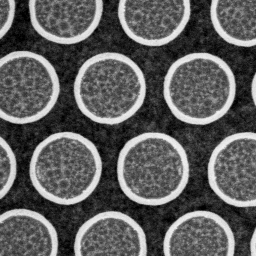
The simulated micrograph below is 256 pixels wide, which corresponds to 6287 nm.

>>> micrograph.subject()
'raised bodies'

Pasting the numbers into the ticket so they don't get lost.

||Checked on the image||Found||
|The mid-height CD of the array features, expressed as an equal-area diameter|66.5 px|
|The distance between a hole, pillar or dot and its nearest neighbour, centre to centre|2180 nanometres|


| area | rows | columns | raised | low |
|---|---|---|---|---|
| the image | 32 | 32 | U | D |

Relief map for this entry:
UDDDUUUUUUUUDDDUUUUUUUUDDDDUUUUU
UDDDUUUUUUUUDDDUUUUUUUUDDDDUUUUU
UDDDUUUUUUUUDDDUUUUUUUUDDDDUUUUU
UDDDDUUUUUUDDDDDUUUUUUUDDDDUUUUU
DDDDDDUUUUDDDDDDDUUUUUDDDDDDUUUU
DDDDDDDDDDDDDDDDDDDDDDDDDDDDDDDD
DDDDDDDDDDDDDDDDDDDDDDDDDDDDDDDD
DUUUUDDDDDDDUUUUDDDDDDDUUUUDDDDD
UUUUUUDDDDDUUUUUUDDDDDUUUUUUDDDD
UUUUUUUDDDUUUUUUUUDDDUUUUUUUUDDD
UUUUUUUDDDUUUUUUUUDDDUUUUUUUUDDD
UUUUUUUDDDUUUUUUUUDDDUUUUUUUUDDD
UUUUUUUDDDUUUUUUUUDDDUUUUUUUUDDD
UUUUUUDDDDUUUUUUUDDDDDUUUUUUDDDD
DUUUUDDDDDDUUUUUDDDDDDDUUUUDDDDD
DDDDDDDDDDDDDDDDDDDDDDDDDDDDDDDD
DDDDDDDDDDDDDDDDDDDDDDDDDDDDDDDD
DDDDDDUUUUDDDDDDDUUUUDDDDDDDDUUU
UDDDDUUUUUUDDDDDUUUUUUDDDDDDUUUU
UDDDUUUUUUUUDDDUUUUUUUUDDDDUUUUU
UUDDUUUUUUUUDDDUUUUUUUUDDDDUUUUU
UUDDUUUUUUUUDDDUUUUUUUUDDDUUUUUU
UDDDUUUUUUUUDDDUUUUUUUUDDDDUUUUU
UDDDDUUUUUUDDDDDUUUUUUDDDDDUUUUU
DDDDDDUUUUDDDDDDDUUUUDDDDDDDUUUU
DDDDDDDDDDDDDDDDDDDDDDDDDDDDDDUD
DDDDDDDDDDDDDDDDDDDDDDDDDDDDDDDD
UUUUUDDDDDDDUUUUDDDDDDDUUUUDDDDD
UUUUUUDDDDDUUUUUUDDDDDUUUUUUDDDD
UUUUUUUDDDUUUUUUUUDDDUUUUUUUUDDD
UUUUUUUDDDUUUUUUUUDDDUUUUUUUUDDD
UUUUUUUDDDUUUUUUUUDDDUUUUUUUUDDD